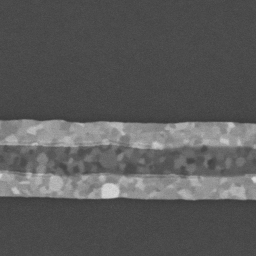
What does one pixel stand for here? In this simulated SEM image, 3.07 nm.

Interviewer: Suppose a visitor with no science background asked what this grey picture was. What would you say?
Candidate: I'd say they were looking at one or a few lines or trenches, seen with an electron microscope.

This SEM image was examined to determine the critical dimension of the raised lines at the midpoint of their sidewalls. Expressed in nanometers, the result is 172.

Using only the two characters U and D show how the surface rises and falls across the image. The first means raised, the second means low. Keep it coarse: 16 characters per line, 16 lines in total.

DDDDDDDDDDDDDDDD
DDDDDDDDDDDDDDDD
DDDDDDDDDDDDDDDD
DDDDDDDDDDDDDDDD
DDDDDDDDDDDDDDDD
DDDDDDDDDDDDDDDD
DDDDDDDDDDDDDDDD
DDDDDDDDDDDDDDDD
UUUUUUUUUUUUUUUU
UUUUUUUUUUUUUUUU
UUUUUUUUUUUUUUUU
UUUUUUUUUUUUUUUU
DDDDDDDDDDDDDDDD
DDDDDDDDDDDDDDDD
DDDDDDDDDDDDDDDD
DDDDDDDDDDDDDDDD